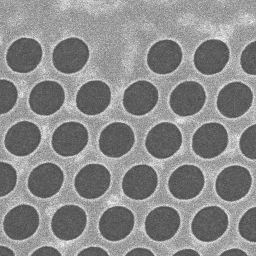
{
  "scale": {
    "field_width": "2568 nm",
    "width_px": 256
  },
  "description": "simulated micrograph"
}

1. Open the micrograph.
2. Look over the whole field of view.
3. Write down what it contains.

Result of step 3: a regular array of holes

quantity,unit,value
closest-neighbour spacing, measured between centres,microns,0.468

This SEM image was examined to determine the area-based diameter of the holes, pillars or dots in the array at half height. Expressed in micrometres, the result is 0.361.